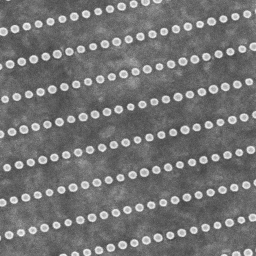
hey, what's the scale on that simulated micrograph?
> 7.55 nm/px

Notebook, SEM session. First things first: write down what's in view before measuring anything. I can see a regular array of raised bodies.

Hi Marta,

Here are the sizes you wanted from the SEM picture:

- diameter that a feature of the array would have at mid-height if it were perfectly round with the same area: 55.2 nm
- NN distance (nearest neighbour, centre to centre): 90.5 nm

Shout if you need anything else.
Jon